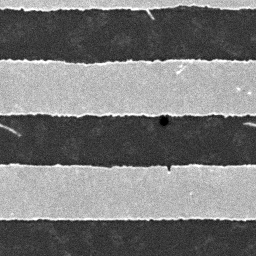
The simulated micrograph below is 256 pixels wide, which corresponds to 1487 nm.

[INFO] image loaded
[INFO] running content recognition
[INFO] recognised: one or a few lines or trenches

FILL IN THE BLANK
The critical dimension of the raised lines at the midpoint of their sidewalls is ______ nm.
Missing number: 312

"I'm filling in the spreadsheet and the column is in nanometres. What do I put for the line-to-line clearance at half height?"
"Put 301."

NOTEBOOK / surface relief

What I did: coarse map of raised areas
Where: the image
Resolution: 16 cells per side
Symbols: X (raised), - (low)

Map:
XXXXXXXXXX----XX
----------------
----------------
----------------
XXXXXXXXXXXXXXXX
XXXXXXXXXXXXXXXX
XXXXXXXXXXXXXXXX
----------------
----------------
----------------
XXXXXXXXXXXXXXXX
XXXXXXXXXXXXXXXX
XXXXXXXXXXXXXXXX
XXXXXXXXXXXXXXXX
----------------
----------------